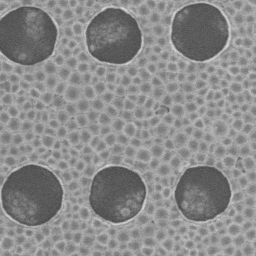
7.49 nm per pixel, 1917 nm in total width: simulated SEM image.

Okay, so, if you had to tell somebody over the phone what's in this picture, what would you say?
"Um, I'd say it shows holes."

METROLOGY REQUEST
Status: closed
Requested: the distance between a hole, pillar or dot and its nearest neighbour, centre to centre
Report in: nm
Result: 643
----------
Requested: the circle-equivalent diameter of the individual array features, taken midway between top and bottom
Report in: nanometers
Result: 427